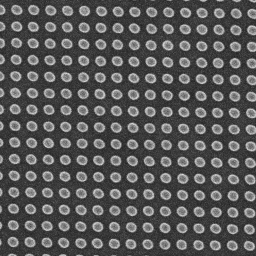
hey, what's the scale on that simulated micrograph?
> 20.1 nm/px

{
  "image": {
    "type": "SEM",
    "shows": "a regular array of raised bodies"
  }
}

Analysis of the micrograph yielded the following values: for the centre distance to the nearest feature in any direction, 16.5 px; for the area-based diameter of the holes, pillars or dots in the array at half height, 0.185 micrometres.